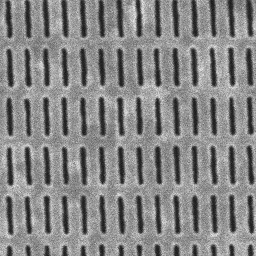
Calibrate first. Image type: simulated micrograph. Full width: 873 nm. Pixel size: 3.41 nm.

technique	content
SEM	a regular array of holes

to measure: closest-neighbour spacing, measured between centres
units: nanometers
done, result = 62.6